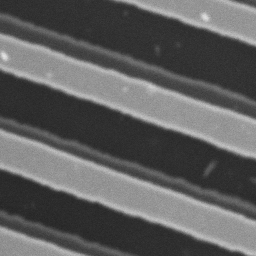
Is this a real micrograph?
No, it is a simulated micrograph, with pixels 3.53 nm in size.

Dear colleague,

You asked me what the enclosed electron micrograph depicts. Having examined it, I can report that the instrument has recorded lines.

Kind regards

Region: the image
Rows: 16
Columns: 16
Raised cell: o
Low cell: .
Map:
.........ooooooo
............oooo
o..............o
oooo............
ooooooo.........
...ooooooo......
......ooooooo...
.........ooooooo
o...........oooo
oooo...........o
ooooooo.........
...oooooo.......
.....ooooooo....
........ooooooo.
o...........oooo
oooo..........oo